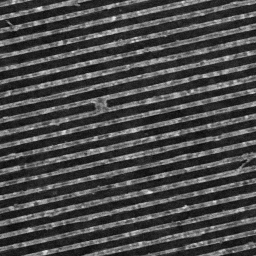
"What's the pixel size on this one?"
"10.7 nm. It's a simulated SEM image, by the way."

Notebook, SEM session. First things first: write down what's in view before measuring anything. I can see parallel lines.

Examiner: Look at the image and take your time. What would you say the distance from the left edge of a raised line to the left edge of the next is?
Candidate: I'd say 134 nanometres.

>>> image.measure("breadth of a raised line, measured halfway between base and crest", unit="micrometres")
0.0417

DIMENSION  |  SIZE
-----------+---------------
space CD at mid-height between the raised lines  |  95.2 nm